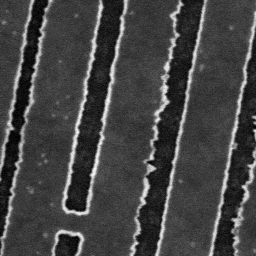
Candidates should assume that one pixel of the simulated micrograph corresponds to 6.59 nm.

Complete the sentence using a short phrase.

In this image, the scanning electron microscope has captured one or a few lines or trenches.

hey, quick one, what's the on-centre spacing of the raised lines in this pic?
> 0.507 micrometres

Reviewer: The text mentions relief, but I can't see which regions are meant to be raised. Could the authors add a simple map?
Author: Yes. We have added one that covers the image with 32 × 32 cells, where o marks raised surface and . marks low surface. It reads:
oooo..ooooooo...ooooooo...oooooo
oooo..ooooooo..ooooooo...ooooooo
oooo.ooooooo...ooooooo...ooooooo
ooo..ooooooo...ooooooo...ooooooo
ooo..ooooooo...ooooooo...ooooooo
ooo..ooooooo...ooooooo...oooooo.
ooo..ooooooo...oooooo...ooooooo.
ooo..oooooo...ooooooo...ooooooo.
ooo.ooooooo...ooooooo...ooooooo.
oo..ooooooo...ooooooo...ooooooo.
oo..ooooooo...ooooooo...ooooooo.
oo..ooooooo...ooooooo..ooooooo..
oo..ooooooo..oooooooo..ooooooo..
oo.ooooooo...ooooooo...ooooooo..
o..ooooooo...ooooooo...ooooooo..
o..ooooooo...ooooooo...ooooooo..
o..ooooooo...oooooo...ooooooo...
o..oooooo....oooooo...ooooooo...
...oooooo...ooooooo...ooooooo...
...oooooo...ooooooo...ooooooo...
..ooooooo...ooooooo...ooooooo...
..ooooooo...ooooooo..ooooooo...o
..ooooooo..ooooooo...ooooooo...o
.ooooooo...ooooooo...ooooooo...o
.ooooooo...ooooooo...ooooooo...o
.ooooooo...ooooooo...ooooooo..oo
.oooooooo.ooooooo....oooooo...oo
.oooooooooooooooo...ooooooo...oo
.oooooooooooooooo...ooooooo..ooo
ooooooo...ooooooo...ooooooo..ooo
ooooooo...ooooooo...ooooooo..ooo
ooooooo...ooooooo...ooooooo..ooo